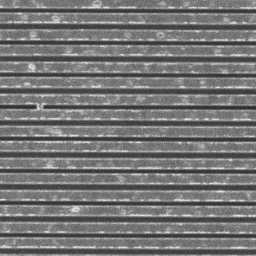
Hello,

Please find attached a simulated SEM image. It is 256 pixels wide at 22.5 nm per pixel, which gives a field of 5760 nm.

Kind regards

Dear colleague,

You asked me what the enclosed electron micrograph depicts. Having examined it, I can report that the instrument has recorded parallel lines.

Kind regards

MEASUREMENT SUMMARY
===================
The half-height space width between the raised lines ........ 121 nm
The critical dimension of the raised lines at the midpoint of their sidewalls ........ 0.242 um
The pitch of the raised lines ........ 361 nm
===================